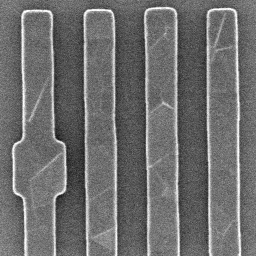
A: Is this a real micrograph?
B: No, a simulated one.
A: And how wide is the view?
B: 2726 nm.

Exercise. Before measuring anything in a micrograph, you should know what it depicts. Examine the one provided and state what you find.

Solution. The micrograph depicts wiring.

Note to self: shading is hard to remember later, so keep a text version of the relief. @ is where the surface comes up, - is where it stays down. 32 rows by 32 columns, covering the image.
--------------------------------
---@@@-----@@@----@@@@----@@@---
---@@@-----@@@----@@@@----@@@---
---@@@-----@@@----@@@@----@@@@--
---@@@-----@@@----@@@@----@@@@--
---@@@-----@@@----@@@@----@@@@--
---@@@@----@@@----@@@@----@@@@--
---@@@@----@@@----@@@@----@@@@--
---@@@@----@@@----@@@@----@@@@--
---@@@@----@@@----@@@@----@@@@--
---@@@@----@@@----@@@@----@@@@--
---@@@@----@@@----@@@@----@@@@--
---@@@@----@@@----@@@@----@@@@--
---@@@@----@@@----@@@@----@@@@--
---@@@@----@@@----@@@@----@@@@--
---@@@@----@@@----@@@@----@@@@--
---@@@@----@@@----@@@@----@@@@--
---@@@@----@@@----@@@@----@@@@--
--@@@@@@---@@@----@@@@----@@@@--
--@@@@@@---@@@----@@@@----@@@@--
--@@@@@@---@@@----@@@@----@@@@--
--@@@@@@---@@@----@@@@----@@@@--
--@@@@@@---@@@-----@@@----@@@@--
--@@@@@@---@@@-----@@@----@@@@--
--@@@@@----@@@-----@@@----@@@@--
---@@@@----@@@-----@@@----@@@@--
---@@@@----@@@-----@@@----@@@@--
---@@@@----@@@-----@@@----@@@@--
---@@@@----@@@-----@@@----@@@@--
---@@@@----@@@-----@@@----@@@@--
---@@@@----@@@-----@@@----@@@@--
---@@@@----@@@-----@@@----@@@@--